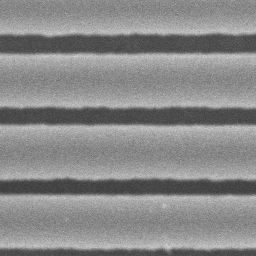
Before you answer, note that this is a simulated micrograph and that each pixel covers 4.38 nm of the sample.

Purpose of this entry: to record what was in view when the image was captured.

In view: lines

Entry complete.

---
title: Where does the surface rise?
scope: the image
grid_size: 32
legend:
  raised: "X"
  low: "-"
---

XXXXXXXXXXXXXXXXXXXXXXXXXXXXXXXX
XXXXXXXXXXXXXXXXXXXXXXXXXXXXXXXX
XXXXXXXXXXXXXXXXXXXXXXXXXXXXXXXX
XXXXXXXXXXXXXXXXXXXXXXXXXXXXXXXX
--------------------------------
--------------------------------
--------------------------------
XXXXXXXXXXXXXXXXXXXXXXXXXXXXXXXX
XXXXXXXXXXXXXXXXXXXXXXXXXXXXXXXX
XXXXXXXXXXXXXXXXXXXXXXXXXXXXXXXX
XXXXXXXXXXXXXXXXXXXXXXXXXXXXXXXX
XXXXXXXXXXXXXXXXXXXXXXXXXXXXXXXX
XXXXXXXXXXXXXXXXXXXXXXXXXXXXXXXX
--------------------------------
--------------------------------
--------------------------------
XXXXXXXXXXXXXXXXXXXXXXXXXXXXXXXX
XXXXXXXXXXXXXXXXXXXXXXXXXXXXXXXX
XXXXXXXXXXXXXXXXXXXXXXXXXXXXXXXX
XXXXXXXXXXXXXXXXXXXXXXXXXXXXXXXX
XXXXXXXXXXXXXXXXXXXXXXXXXXXXXXXX
XXXXXXXXXXXXXXXXXXXXXXXXXXXXXXXX
--------------------------------
--------------------------------
-XXXXX--------------------------
XXXXXXXXXXXXXXXXXXXXXXXXXXXXXXXX
XXXXXXXXXXXXXXXXXXXXXXXXXXXXXXXX
XXXXXXXXXXXXXXXXXXXXXXXXXXXXXXXX
XXXXXXXXXXXXXXXXXXXXXXXXXXXXXXXX
XXXXXXXXXXXXXXXXXXXXXXXXXXXXXXXX
XXXXXXXXXXXXXXXXXXXXXXXXXXXXXXXX
--------------------------------